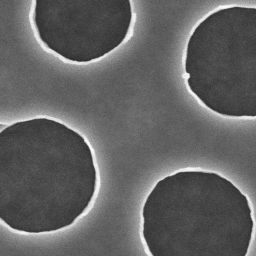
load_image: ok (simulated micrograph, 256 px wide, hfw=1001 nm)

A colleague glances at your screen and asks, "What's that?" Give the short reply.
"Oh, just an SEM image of holes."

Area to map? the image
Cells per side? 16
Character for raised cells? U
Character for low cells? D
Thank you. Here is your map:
UUDDDDDDUUUUUUDD
UUDDDDDDUUUUUDDD
UUUDDDDDUUUUDDDD
UUUUDDUUUUUUDDDD
UUUUUUUUUUUUDDDD
UUUUUUUUUUUUDDDD
UUUUUUUUUUUUUDDD
UUDUUUUUUUUUUUUU
DDDDDUUUUUUUUUUU
DDDDDDUUUUUUUUUU
DDDDDDUUUUUUUUUU
DDDDDDUUUUDDDDDU
DDDDDDUUUDDDDDDU
DDDDDUUUUDDDDDDD
UUDUUUUUUDDDDDDD
UUUUUUUUUDDDDDDU